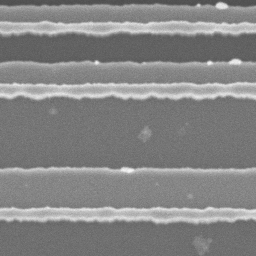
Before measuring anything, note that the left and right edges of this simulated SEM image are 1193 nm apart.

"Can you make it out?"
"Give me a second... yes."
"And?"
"lines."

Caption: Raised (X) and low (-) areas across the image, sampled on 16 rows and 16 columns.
XXXXXXXXXXXXXXXX
XXXXXXXXXXXXXXXX
----------------
----------------
XXXXXXXXXXXXXXXX
XXXXXXXXXXXXXXXX
----------------
----------------
----------------
----------------
----------------
XXXXXXXXXXXXXXXX
XXXXXXXXXXXXXXXX
XXXXXXXXXXXXXXXX
----------------
----------------